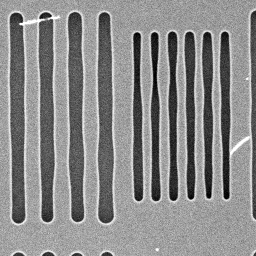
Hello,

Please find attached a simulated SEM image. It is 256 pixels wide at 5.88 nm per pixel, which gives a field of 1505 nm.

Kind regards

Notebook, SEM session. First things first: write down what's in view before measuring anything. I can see groups of lines, slits or small figures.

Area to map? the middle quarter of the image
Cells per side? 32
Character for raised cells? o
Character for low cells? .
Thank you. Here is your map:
o....ooo....ooooo..ooo.ooo..oo..
o....ooo....ooooo..ooo.ooo..oo..
o....ooo....ooooo..ooo.ooo..oo..
o....ooo....ooooo..ooo.ooo..oo..
o....ooo....ooooo..ooo.ooo..oo..
o....ooo....ooooo..ooo.ooo..oo..
o....ooo....ooooo..ooo..oo..oo..
o....ooo....ooooo..ooo..oo..oo..
o....ooo....ooooo..ooo..oo...o..
o....ooo....ooooo..ooo..oo...o..
o....ooo....ooooo...oo..oo...o..
o....ooo....ooooo...o...oo..oo..
o....oooo...ooooo...o...oo..oo..
o....oooo...ooooo...oo..oo..ooo.
o....oooo...ooooo...oo..oo..ooo.
o....oooo...ooooo...oo..oo..ooo.
o....oooo...ooooo...oo..oo..ooo.
o....oooo...ooooo...oo..oo..ooo.
o....oooo...ooooo...oo..oo..ooo.
o....ooo....ooooo...oo..oo..ooo.
o....ooo....ooooo...oo..oo..ooo.
o....ooo....ooooo...oo..oo..ooo.
o....ooo.....oooo...oo..oo..ooo.
o....ooo.....oooo...oo..oo..ooo.
o....ooo.....oooo...oo..oo..ooo.
o....ooo....ooooo...oo..oo..ooo.
o....ooo....ooooo...oo..oo...oo.
o....oooo...ooooo...oo..oo...oo.
o....oooo...ooooo...oo..oo...oo.
o....oooo...ooooo...oo..oo...oo.
oo...oooo...ooooo...oo..oo...oo.
oo...oooo...ooooo...oo..oo...oo.